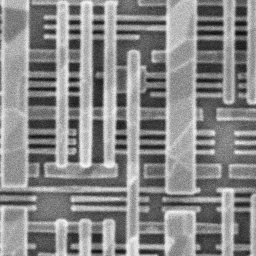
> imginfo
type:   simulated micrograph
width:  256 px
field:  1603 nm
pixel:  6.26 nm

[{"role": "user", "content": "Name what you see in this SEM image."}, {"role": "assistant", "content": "wiring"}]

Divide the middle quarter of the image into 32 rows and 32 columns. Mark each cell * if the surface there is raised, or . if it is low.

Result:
*...***...***...***.......******
*...***...***...***.......******
*...***...***...***.......******
*...***...***...***.......******
*...***...***...***.......******
*...***...***...***.......******
*...***...***...***.......******
*...***...***...***.......******
*...***...***...***.......******
*...***...***...***.......******
*...***...***...***.......******
*...***...***...***.......******
*...***...***...***.......******
*...***...***...***.......******
*...***...***...***.......******
*...***...***...***.......******
*...***...***...***.......******
*...***...***...***.......******
*...***...***...***.......******
*...***...***...***.......******
*...***...***...**........******
*...***...***...**........******
*...***...***...**........******
*...***...***...**........******
*...***...***...**........******
.....*....**....**........******
................**........******
................**........******
................**........******
................**........******
................**........******
................**........******